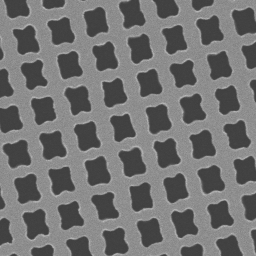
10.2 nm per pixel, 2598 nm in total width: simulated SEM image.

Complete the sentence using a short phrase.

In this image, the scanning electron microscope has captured a regular array of holes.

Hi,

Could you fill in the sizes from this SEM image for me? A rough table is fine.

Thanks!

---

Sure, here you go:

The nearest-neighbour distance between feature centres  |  361 nanometers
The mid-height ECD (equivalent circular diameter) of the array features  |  0.259 microns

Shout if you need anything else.